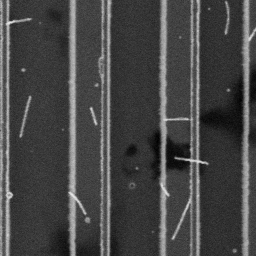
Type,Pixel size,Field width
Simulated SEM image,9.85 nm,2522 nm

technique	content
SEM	lines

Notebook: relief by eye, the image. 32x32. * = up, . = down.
*........*****.......****......*
*........*****.......****......*
*........*****......*****......*
*........****........****......*
*........****........****......*
*........****........****......*
*........****........****......*
*........****.......*****......*
*........****.......*****......*
*........****.......*****......*
*........****.......*****......*
*........****.......*****......*
*........****.......*****......*
*........****.......*****......*
*........****.......*****......*
*........****.......*****......*
*........****........****......*
*........****........****......*
*........****.......*****......*
*........****.......*****......*
*........****.......*****......*
*........****.......*****......*
*........****.......*****......*
*........****.......*****......*
*........****.......*****......*
*........*****......*****......*
*........****.......*****......*
*........****.......*****......*
*........****.......*****......*
*........****.......*****......*
*........****.......*****......*
*........****.......*****......*